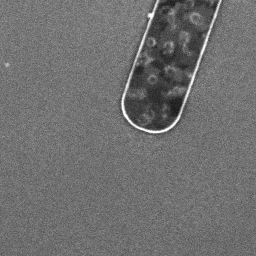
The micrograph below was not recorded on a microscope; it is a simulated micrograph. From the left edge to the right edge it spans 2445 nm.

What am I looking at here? one or a few lines or trenches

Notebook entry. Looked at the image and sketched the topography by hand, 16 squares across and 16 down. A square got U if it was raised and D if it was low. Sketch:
DDDDDDDDDDUUUUDD
DDDDDDDDDUUUUDDD
DDDDDDDDDUUUUDDD
DDDDDDDDDUUUUDDD
DDDDDDDDUUUUDDDD
DDDDDDDDUUUUDDDD
DDDDDDDDUUUUDDDD
DDDDDDDDUUUDDDDD
DDDDDDDDDDDDDDDD
DDDDDDDDDDDDDDDD
DDDDDDDDDDDDDDDD
DDDDDDDDDDDDDDDD
DDDDDDDDDDDDDDDD
DDDDDDDDDDDDDDDD
DDDDDDDDDDDDDDDD
DDDDDDDDDDDDDDDD